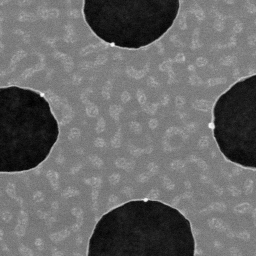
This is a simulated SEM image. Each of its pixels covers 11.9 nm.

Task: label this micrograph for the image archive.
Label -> holes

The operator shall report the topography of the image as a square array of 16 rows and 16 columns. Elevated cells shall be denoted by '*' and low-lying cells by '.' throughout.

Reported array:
*****......*****
******.....*****
******....******
****************
****************
.*************..
...**********...
...**********...
....*********...
...***********..
..**************
****************
****************
*******....*****
******......****
******......****